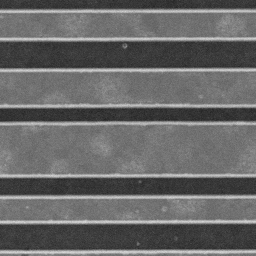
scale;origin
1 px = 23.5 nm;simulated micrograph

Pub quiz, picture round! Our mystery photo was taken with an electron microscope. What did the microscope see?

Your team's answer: one or a few lines or trenches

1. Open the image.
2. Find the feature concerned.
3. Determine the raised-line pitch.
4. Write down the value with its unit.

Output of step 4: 1.44 um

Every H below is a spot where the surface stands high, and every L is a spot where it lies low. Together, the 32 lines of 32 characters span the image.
LLLLLLLLLLLLLLLLLLLLLLLLLLLLLLLL
HHHHHHHHHHHHHHHHHHHHHHHHHHHHHHHH
HHHHHHHHHHHHHHHHHHHHHHHHHHHHHHHH
HHHHHHHHHHHHHHHHHHHHHHHHHHHHHHHH
HHHHHHHHHHHHHHHHHHHHHHHHHHHHHHHH
LLLLLLLLLLLLLLLLLLLLLLLLLLLLLLLL
LLLLLLLLLLLLLLLLLLLLLLLLLLLLLLLL
LLLLLLLLLLLLLLLLLLLLLLLLLLLLLLLL
LLLLLLLLLLLLLLLLLLLLLLLLLLLLLLLL
HHHHHHHHHHHHHHHHHHHHHHHHHHHHHHHH
HHHHHHHHHHHHHHHHHHHHHHHHHHHHHHHH
HHHHHHHHHHHHHHHHHHHHHHHHHHHHHHHH
HHHHHHHHHHHHHHHHHHHHHHHHHHHHHHHH
LLLLLLLLLLLLLLLLLLLLLLLLLLLLLLLL
LLLLLLLLLLLLLLLLLLLLLLLLLLLLLLLL
LLLLLLLLLLLLLHHHLLHHHHLLLLLLLLLL
HHHHHHHHHHHHHHHHHHHHHHHHHHHHHHHH
HHHHHHHHHHHHHHHHHHHHHHHHHHHHHHHH
HHHHHHHHHHHHHHHHHHHHHHHHHHHHHHHH
HHHHHHHHHHHHHHHHHHHHHHHHHHHHHHHH
HHHHHHHHHHHHHHHHHHHHHHHHHHHHHHHH
HHHHHHHHHHHHHHHHHHHHHHHHHHHHHHHH
LLLLLLLLLLLLLLLLLLLLLLLLLLLLLLLL
LLLLLLLLLLLLLLLLLLLLLLLLLLLLLLLL
LLLLLLLLLLLLLLLLLLLLLLLLLLLLLLLL
HHHHHHHHHHHHHHHHHHHHHHHHHHHHHHHH
HHHHHHHHHHHHHHHHHHHHHHHHHHHHHHHH
HHHHHHHHHHHHHHHHHHHHHHHHHHHHHHHH
LLLLLLLLLLLLLLLLLLLLLLLLLLLLLLLL
LLLLLLLLLLLLLLLLLLLLLLLLLLLLLLLL
LLLLLLLLLLLLLLLLLLLLLLLLLLLLLLLL
LLLLLLLLLLLLLLLLLLLLLLLLLLLLLLLL